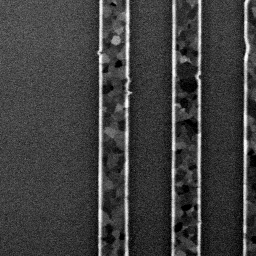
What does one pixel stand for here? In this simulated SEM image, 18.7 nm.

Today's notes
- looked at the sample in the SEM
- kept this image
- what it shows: one or a few lines or trenches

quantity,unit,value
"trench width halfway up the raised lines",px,46.9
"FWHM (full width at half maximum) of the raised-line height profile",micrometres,0.485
